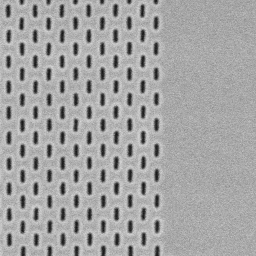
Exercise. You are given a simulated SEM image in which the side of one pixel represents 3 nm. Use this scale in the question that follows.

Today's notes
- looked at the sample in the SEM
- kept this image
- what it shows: a regular array of holes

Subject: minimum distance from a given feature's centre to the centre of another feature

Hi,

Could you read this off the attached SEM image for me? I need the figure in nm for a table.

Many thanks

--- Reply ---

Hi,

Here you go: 54.5